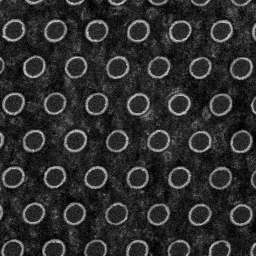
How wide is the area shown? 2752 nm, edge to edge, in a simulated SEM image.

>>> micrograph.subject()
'a regular array of raised bodies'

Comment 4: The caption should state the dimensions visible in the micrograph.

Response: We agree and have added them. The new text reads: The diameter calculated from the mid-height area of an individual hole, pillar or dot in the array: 227 nanometres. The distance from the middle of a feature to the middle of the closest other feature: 443 nm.